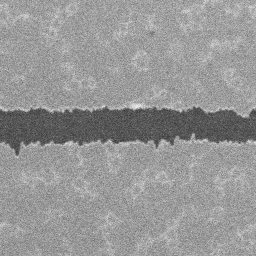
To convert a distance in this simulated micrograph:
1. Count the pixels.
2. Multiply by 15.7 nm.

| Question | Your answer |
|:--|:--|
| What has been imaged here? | one or a few lines or trenches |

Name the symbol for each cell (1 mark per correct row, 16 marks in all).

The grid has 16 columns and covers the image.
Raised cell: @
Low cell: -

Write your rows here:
@@@@@@@@@@@@@@@@
@@@@@@@@@@@@@@@@
@@@@@@@@@@@@@@@@
@@@@@@@@@@@@@@@@
@@@@@@@@@@@@@@@@
@@@@@@@@@@@@@@@@
@@@@@@@@@@@@@@@@
----------------
----------------
@@@@@@@@@@@@@@@@
@@@@@@@@@@@@@@@@
@@@@@@@@@@@@@@@@
@@@@@@@@@@@@@@@@
@@@@@@@@@@@@@@@@
@@@@@@@@@@@@@@@@
@@@@@@@@@@@@@@@@